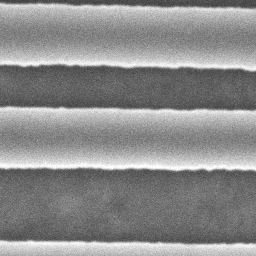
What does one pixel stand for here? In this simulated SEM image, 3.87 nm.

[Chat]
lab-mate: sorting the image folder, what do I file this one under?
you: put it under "lines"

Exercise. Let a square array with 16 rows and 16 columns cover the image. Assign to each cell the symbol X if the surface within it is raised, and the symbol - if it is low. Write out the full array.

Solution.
XXXXXXXXXXXXX---
XXXXXXXXXXXXXXXX
XXXXXXXXXXXXXXXX
XXXXXXXXXXXXXXXX
----------------
----------------
----------------
XXXXXXXXXXXXXXXX
XXXXXXXXXXXXXXXX
XXXXXXXXXXXXXXXX
------XX-XXXXXXX
----------------
----------------
----------------
----------------
XXXXXXXXXXXXXXXX